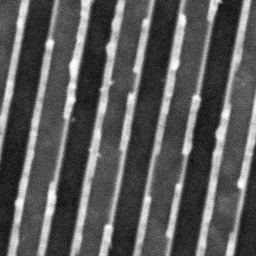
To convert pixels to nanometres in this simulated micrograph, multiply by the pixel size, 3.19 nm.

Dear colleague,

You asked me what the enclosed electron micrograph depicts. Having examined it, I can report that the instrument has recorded one or a few lines or trenches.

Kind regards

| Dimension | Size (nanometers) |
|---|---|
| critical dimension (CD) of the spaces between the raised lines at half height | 87.9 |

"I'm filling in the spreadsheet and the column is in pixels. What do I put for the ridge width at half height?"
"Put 34.2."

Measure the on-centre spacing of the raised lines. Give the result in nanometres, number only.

198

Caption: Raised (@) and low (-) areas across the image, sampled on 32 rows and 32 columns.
@@@----@@@@----@@@@----@@@@----@
@@@----@@@@----@@@@----@@@@---@@
@@@----@@@@---@@@@@---@@@@@---@@
@@@---@@@@@---@@@@----@@@@----@@
@@@---@@@@@---@@@@----@@@@----@@
@@----@@@@----@@@@----@@@@----@@
@@----@@@@---@@@@@----@@@@---@@@
@@---@@@@@---@@@@@---@@@@@---@@@
@@---@@@@@---@@@@@---@@@@----@@@
@@---@@@@@---@@@@----@@@@----@@@
@@---@@@@----@@@@----@@@@----@@@
@@---@@@@----@@@@----@@@@---@@@@
@----@@@@----@@@@----@@@@---@@@@
@---@@@@@---@@@@@---@@@@@---@@@@
@---@@@@@---@@@@----@@@@----@@@@
@---@@@@----@@@@----@@@@----@@@@
----@@@@----@@@@----@@@@---@@@@@
----@@@@----@@@@---@@@@@---@@@@@
----@@@@---@@@@@---@@@@@---@@@@@
---@@@@@---@@@@----@@@@----@@@@-
---@@@@----@@@@----@@@@----@@@@-
---@@@@----@@@@----@@@@----@@@@-
---@@@@----@@@@----@@@@---@@@@@-
--@@@@@----@@@@---@@@@@---@@@@--
--@@@@@---@@@@@---@@@@----@@@@--
--@@@@@---@@@@----@@@@----@@@@--
--@@@@@---@@@@----@@@@----@@@@--
--@@@@----@@@@----@@@@---@@@@@--
--@@@@----@@@@---@@@@@---@@@@@--
--@@@@---@@@@@---@@@@----@@@@---
-@@@@@---@@@@@---@@@@----@@@@---
-@@@@@---@@@@----@@@@----@@@@---